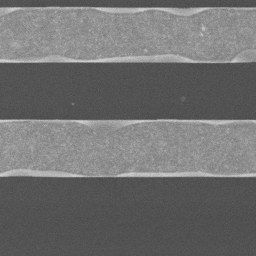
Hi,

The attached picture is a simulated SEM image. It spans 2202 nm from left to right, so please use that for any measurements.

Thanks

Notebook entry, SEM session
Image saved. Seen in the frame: wiring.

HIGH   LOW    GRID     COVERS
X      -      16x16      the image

-XXXXX-------XXX
XXXXXXXXXXXXXXXX
XXXXXXXXXXXXXXXX
XXXXXXXXXXXXXXX-
----------------
----------------
----------------
----------------
XXXXXXXXXXXXXXXX
XXXXXXXXXXXXXXXX
XXXXXXXXXXXXXXXX
----------------
----------------
----------------
----------------
----------------